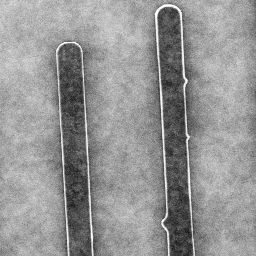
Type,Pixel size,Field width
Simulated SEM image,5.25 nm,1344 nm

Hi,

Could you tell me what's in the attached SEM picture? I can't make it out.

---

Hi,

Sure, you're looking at one or a few lines or trenches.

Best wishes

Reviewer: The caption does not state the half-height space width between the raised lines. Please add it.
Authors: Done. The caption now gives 398 nanometers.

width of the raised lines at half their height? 128 nm